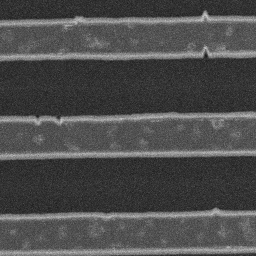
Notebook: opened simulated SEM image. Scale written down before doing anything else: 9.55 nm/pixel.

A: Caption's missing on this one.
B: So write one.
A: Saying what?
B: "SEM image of one or a few lines or trenches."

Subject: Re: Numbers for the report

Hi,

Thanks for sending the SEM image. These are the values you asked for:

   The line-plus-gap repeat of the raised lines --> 932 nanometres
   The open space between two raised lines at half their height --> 567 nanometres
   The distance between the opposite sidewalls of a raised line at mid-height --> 360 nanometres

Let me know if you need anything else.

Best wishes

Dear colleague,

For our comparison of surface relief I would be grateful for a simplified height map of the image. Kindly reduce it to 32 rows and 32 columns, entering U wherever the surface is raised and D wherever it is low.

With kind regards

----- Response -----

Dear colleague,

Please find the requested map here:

DDDDDDDDDDDDDDDDDDDDDDDDDDDDDDDD
DDDDDDDDDDDDDDDDDDDDDDDDDDDDDDDD
DDDDDDDDDUUDDDDDDDDUUDUUUUUUUUUU
UUUUUUUUUUUUUUUUUUUUUUUUUUUUUUUU
UUUUUUUUUUUUUUUUUUUUUUUUUUUUUUUU
UUUUUUUUUUUUUUUUUUUUUUUUUUUUUUUU
UUUUUUUUUUUUUUUUUUUUUUUUUUUUUUUU
DDDDDDDDDDDDDDDDDDDDDDDDDDDDDDDD
DDDDDDDDDDDDDDDDDDDDDDDDDDDDDDDD
DDDDDDDDDDDDDDDDDDDDDDDDDDDDDDDD
DDDDDDDDDDDDDDDDDDDDDDDDDDDDDDDD
DDDDDDDDDDDDDDDDDDDDDDDDDDDDDDDD
DDDDDDDDDDDDDDDDDDDDDDDDDDDDDDDD
DDDDDDDDDDDDDDDDDDDDDDDDDDDDDDDD
DDDDDDDDDDDDDDDDDDUUUUUUUUUUUUUU
UUUUUUUUUUUUUUUUUUUUUUUUUUUUUUUU
UUUUUUUUUUUUUUUUUUUUUUUUUUUUUUUU
UUUUUUUUUUUUUUUUUUUUUUUUUUUUUUUU
UUUUUUUUUUUUUUUUUUUUUUUUUUUUUUUU
UUUUUUUDDDDDDDDDDDDDDDDDDDDDDDDD
DDDDDDDDDDDDDDDDDDDDDDDDDDDDDDDD
DDDDDDDDDDDDDDDDDDDDDDDDDDDDDDDD
DDDDDDDDDDDDDDDDDDDDDDDDDDDDDDDD
DDDDDDDDDDDDDDDDDDDDDDDDDDDDDDDD
DDDDDDDDDDDDDDDDDDDDDDDDDDDDDDDD
DDDDDDDDDDDDDDDDDDDDDDDDDDDDDDDD
DDDDDDDDDDDDDDDDDDDDDDDDDDUUDDDD
UUUUUUUUUUUUUUUUUUUUUUUUUUUUUUUU
UUUUUUUUUUUUUUUUUUUUUUUUUUUUUUUU
UUUUUUUUUUUUUUUUUUUUUUUUUUUUUUUU
UUUUUUUUUUUUUUUUUUUUUUUUUUUUUUUU
UUUUUUUUUUUUUUUUUUDDDDDDDDDDDDDD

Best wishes